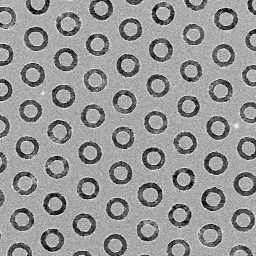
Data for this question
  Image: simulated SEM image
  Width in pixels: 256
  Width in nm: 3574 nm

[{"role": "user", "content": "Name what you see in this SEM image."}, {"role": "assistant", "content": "a regular array of ring-shaped grooves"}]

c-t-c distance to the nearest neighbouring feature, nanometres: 498